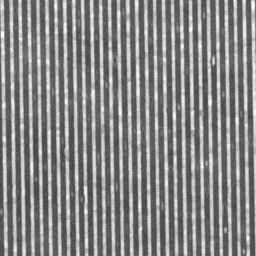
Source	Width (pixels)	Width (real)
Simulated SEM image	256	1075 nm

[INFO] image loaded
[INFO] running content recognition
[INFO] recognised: parallel lines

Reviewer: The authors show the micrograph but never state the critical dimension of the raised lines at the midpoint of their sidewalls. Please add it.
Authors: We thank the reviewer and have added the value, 10 nm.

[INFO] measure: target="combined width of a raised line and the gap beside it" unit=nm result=37.6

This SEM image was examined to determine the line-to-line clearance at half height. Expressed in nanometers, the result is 26.2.